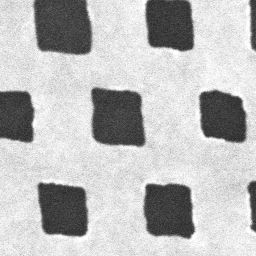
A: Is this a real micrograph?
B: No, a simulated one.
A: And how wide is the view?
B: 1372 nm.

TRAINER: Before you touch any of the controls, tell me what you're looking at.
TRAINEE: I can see holes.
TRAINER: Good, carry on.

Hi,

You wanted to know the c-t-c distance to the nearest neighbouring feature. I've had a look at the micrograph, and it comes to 564 nm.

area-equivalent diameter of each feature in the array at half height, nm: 299